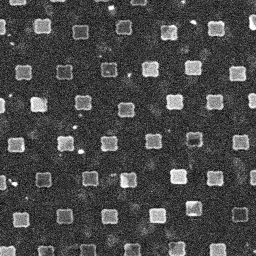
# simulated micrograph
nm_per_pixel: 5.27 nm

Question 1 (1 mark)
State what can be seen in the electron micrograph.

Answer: a regular array of raised bodies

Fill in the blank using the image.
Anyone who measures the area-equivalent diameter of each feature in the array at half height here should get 83.7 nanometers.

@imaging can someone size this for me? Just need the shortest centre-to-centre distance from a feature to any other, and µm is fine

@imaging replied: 0.206